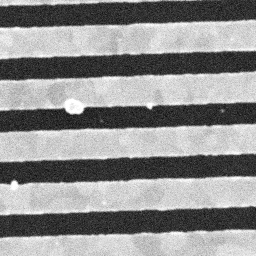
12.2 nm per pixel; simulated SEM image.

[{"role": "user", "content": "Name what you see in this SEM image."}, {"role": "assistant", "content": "lines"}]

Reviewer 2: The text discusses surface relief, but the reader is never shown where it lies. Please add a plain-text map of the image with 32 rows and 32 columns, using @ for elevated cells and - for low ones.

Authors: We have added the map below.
@@@@@@@-------------------------
--------------------------------
--------------------------------
-@@-@@@@@@@@@@@@@@@@@@@@@@@@@@@@
@@@@@@@@@@@@@@@@@@@@@@@@@@@@@@@@
@@@@@@@@@@@@@@@@@@@@@@@@@@@@@@@@
@@@@@@@@@@@@@@@@@@@@@@@@--------
--------------------------------
--------------------------------
------------------@-@@@@@@@@@@@@
@@@@@@@@@@@@@@@@@@@@@@@@@@@@@@@@
@@@@@@@@@@@@@@@@@@@@@@@@@@@@@@@@
@@@@@@@@@@@@@@@@@@@@@@@@@@@@@@@@
@@@@@---@@@---------------------
--------------------------------
--------------------------------
----@@@@@@@@@@@@@@@@@@@@@@@@@@@@
@@@@@@@@@@@@@@@@@@@@@@@@@@@@@@@@
@@@@@@@@@@@@@@@@@@@@@@@@@@@@@@@@
@@@@@@@@@@@@@@@@@@@-------------
--------------------------------
--------------------------------
-------------------@@@@@@@@@@@@@
@@@@@@@@@@@@@@@@@@@@@@@@@@@@@@@@
@@@@@@@@@@@@@@@@@@@@@@@@@@@@@@@@
@@@@@@@@@@@@@@@@@@@@@@@@@@@@@@@@
@@@@@@@@@-----------------------
--------------------------------
--------------------------------
------------@@@@@@@@@@@@@@@@@@@@
@@@@@@@@@@@@@@@@@@@@@@@@@@@@@@@@
@@@@@@@@@@@@@@@@@@@@@@@@@@@@@@@@